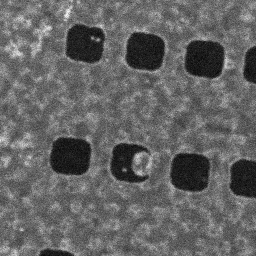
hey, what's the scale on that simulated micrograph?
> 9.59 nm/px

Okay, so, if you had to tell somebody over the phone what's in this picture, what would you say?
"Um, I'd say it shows holes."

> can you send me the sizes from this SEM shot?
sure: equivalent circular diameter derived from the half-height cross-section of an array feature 406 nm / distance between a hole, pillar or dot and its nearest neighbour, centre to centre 576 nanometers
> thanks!